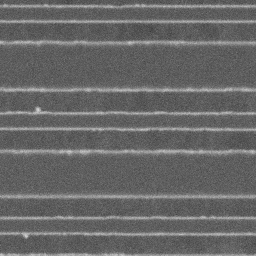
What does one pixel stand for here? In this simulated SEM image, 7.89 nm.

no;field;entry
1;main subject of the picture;lines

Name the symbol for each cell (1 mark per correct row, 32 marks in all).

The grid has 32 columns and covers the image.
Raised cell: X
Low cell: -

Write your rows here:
--------------------------------
XXXXXXXXXXXXXXXXXXXXXXXXXXXXXXXX
XXXXXXXXXXXXXXXXXXXXXXXXXXXXXXXX
--------------------------------
--------------------------------
XXXXXXXXXXXXXXXXXXXXXXXXXXXXXXXX
XXXXXXXXXXXXXXXXXXXXXXXXXXXXXXXX
XXXXXXXXXXXXXXXXXXXXXXXXXXXXXXXX
XXXXXXXXXXXXXXXXXXXXXXXXXXXXXXXX
XXXXXXXXXXXXXXXXXXXXXXXXXXXXXXXX
XXXXXXXXXXXXXXXXXXXXXXXXXXXXXXXX
--------------------------------
--------------------------------
--------------------------------
XXXXXXXXXXXXXXXXXXXXXXXXXXXXXXXX
XXXXXXXXXXXXXXXXXXXXXXXXXXXXXXXX
--------------------------------
--------------------------------
--------------------------------
XXXXXXXXXXXXXXXXXXXXXXXXXXXXXXXX
XXXXXXXXXXXXXXXXXXXXXXXXXXXXXXXX
XXXXXXXXXXXXXXXXXXXXXXXXXXXXXXXX
XXXXXXXXXXXXXXXXXXXXXXXXXXXXXXXX
XXXXXXXXXXXXXXXXXXXXXXXXXXXXXXXX
XXXXXXXXXXXXXXXXXXXXXXXXXXXXXXXX
--------------------------------
--------------------------------
XXXXXXXXXXXXXXXXXXXXXXXXXXXXXXXX
XXXXXXXXXXXXXXXXXXXXXXXXXXXXXXXX
--------------------------------
--------------------------------
--------------------------------